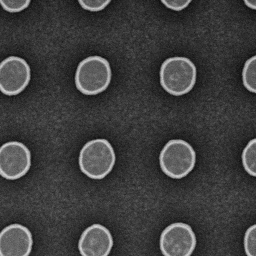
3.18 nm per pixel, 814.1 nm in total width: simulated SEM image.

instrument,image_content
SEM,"raised bodies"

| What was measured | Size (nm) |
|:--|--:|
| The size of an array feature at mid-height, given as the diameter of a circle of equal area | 112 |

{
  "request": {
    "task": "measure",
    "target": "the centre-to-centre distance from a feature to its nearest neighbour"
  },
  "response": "260 nm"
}